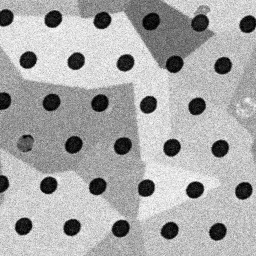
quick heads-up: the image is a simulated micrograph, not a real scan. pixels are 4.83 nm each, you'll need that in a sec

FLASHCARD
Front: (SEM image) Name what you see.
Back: a regular array of holes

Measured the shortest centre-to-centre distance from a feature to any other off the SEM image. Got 0.231 micrometres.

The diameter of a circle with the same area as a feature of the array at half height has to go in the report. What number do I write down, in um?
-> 0.0873